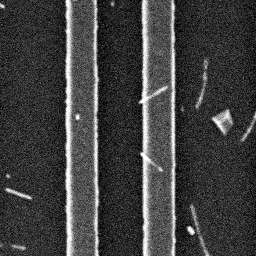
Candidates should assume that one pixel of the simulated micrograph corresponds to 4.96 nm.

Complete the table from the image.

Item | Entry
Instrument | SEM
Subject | lines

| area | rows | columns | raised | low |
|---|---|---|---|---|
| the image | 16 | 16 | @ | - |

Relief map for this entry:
----@@---@@-----
----@@---@@-----
----@@---@@-----
----@@---@@-----
----@@---@@-----
----@@---@@-----
----@@---@@-----
----@@---@@-----
----@@---@@-----
----@@---@@-----
----@@---@@-----
----@@---@@-----
----@@---@@-----
----@@---@@-----
----@@---@@-----
----@@---@@-----